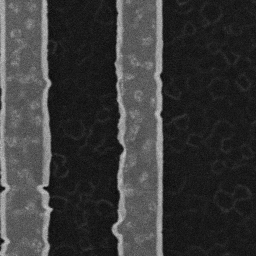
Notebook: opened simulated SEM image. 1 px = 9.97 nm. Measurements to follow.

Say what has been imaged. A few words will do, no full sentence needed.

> one or a few lines or trenches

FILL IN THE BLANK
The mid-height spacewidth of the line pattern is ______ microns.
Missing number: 0.744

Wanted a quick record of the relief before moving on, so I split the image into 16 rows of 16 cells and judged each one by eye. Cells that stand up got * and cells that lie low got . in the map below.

***....***......
***....***......
***....***......
***....***......
***....***......
***....***......
***.....**......
***.....**......
***.....**......
***.....**......
***.....**......
***....***......
***.....**......
***.....**......
***....***......
***....***......